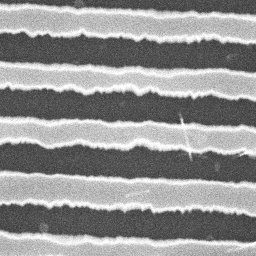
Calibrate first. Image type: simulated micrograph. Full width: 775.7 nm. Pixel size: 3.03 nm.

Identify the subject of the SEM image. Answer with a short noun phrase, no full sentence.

lines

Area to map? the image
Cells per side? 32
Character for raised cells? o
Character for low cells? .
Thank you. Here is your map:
................................
oooooooooooooooooo..............
oooooooooooooooooooooooooooooooo
oooooooooooooooooooooooooooooooo
........o...oooooooooooooooooooo
................................
................................
................................
ooooooooooooo...................
oooooooooooooooooooooooooooooooo
oooooooooooooooooooooooooooooooo
..........oo.....o..oooooooooooo
................................
................................
................................
ooooooooooooooooooooo...........
oooooooooooooooooooooooooooooooo
oooooooooooooooooooooooooooooooo
....................oo.ooooooooo
................................
................................
................................
ooooooooooooooooooooo...........
oooooooooooooooooooooooooooooooo
oooooooooooooooooooooooooooooooo
o.o..ooooooooooooooooooooooooooo
.............................ooo
................................
................................
oooooo..........................
oooooooooooooooooooooooooooooooo
oooooooooooooooooooooooooooooooo